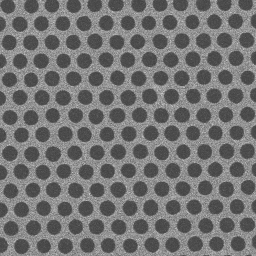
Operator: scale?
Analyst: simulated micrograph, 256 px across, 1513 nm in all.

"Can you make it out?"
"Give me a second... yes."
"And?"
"a regular array of holes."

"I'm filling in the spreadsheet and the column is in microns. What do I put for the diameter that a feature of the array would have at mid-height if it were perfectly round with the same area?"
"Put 0.0868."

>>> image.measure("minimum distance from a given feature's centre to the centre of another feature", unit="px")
20.8